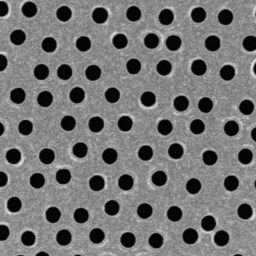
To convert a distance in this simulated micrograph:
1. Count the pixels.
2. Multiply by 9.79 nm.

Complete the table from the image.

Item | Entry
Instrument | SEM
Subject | a regular array of holes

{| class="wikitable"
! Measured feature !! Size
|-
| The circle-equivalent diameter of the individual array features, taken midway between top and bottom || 151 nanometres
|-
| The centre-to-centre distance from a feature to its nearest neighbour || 273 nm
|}